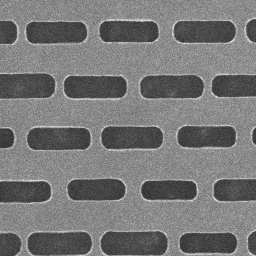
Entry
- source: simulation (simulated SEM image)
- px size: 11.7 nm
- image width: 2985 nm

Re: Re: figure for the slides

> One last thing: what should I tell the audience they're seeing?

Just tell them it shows a regular array of holes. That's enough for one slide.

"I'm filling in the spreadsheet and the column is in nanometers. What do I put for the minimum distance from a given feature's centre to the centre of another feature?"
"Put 731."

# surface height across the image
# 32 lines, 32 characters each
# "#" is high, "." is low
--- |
################################
################################
###########################.###.
..#........#........##.......##.
..#........#........##.......##.
.####.....######################
################################
################################
################################
......###.....####.......##.....
.......#........##.......#......
.......#........##.......##.....
################################
################################
################################
################################
..##.......##.......##.......###
..#........##.......##.......###
.###.......##......#############
################################
################################
################################
#########......######..####.....
......##........##.......##.....
......###......###......###.....
################################
################################
################################
################################
..##.......##........##......##.
............#........#........#.
..##.......##........##......##.